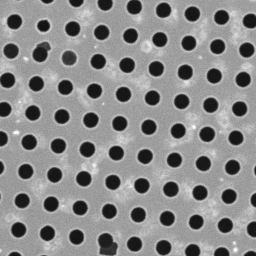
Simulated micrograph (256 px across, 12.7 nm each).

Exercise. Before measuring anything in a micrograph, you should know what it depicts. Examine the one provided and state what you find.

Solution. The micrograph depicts a regular array of holes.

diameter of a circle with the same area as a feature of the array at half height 15.5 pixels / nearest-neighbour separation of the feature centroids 0.37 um